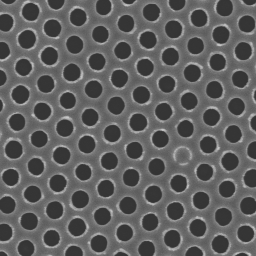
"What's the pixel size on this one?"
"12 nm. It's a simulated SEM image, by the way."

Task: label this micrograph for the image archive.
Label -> a regular array of holes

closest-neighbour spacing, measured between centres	329	nm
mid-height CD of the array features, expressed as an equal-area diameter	207	nm